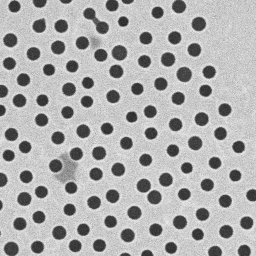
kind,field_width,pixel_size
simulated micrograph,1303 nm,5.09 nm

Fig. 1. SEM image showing a regular array of holes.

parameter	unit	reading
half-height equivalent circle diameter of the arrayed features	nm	67.2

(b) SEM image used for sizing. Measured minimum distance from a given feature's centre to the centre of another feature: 0.113 um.